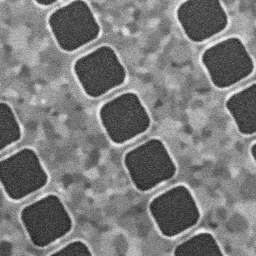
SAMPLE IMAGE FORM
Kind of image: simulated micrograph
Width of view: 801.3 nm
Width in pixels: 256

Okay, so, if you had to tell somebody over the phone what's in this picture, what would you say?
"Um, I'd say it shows holes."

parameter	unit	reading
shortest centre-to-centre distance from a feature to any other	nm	166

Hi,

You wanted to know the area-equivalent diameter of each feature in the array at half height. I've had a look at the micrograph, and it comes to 0.156 microns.